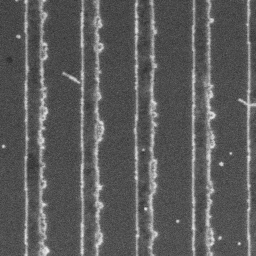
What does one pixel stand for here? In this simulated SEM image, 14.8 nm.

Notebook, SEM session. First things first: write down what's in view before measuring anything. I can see lines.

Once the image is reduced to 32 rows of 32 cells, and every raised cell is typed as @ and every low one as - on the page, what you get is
---@@-----@@-----@@-----@@-----@
---@@-----@@-----@@-----@@-----@
---@@-----@@-----@@-----@@-----@
---@@-----@@-----@@-----@@-----@
---@@-----@@-----@@-----@@-----@
---@@@----@@-----@@-----@@-----@
---@@@----@@-----@@-----@@-----@
---@@-----@@-----@@-----@@-----@
---@@-----@@-----@@-----@@-----@
---@@-----@@-----@@-----@@-----@
---@@-----@@-----@@-----@@-----@
---@@-----@@-----@@-----@@-----@
---@@-----@@-----@@-----@@-----@
---@@@----@@-----@@-----@@-----@
---@@-----@@-----@@-----@@-----@
---@@-----@@@----@@-----@@-----@
---@@-----@@@----@@-----@@-----@
---@@-----@@-----@@-----@@-----@
---@@-----@@-----@@-----@@-----@
---@@-----@@-----@@-----@@-----@
---@@-----@@-----@@-----@@-----@
---@@-----@@-----@@-----@@-----@
---@@-----@@-----@@-----@@-----@
---@@-----@@-----@@-----@@-----@
---@@-----@@-----@@-----@@-----@
---@@-----@@-----@@-----@@-----@
---@@-----@@-----@@-----@@-----@
---@@-----@@-----@@-----@@-----@
---@@-----@@-----@@-----@@-----@
---@@-----@@-----@@-----@@@----@
---@@-----@@-----@@-----@@-----@
---@@@----@@-----@@-----@@-----@